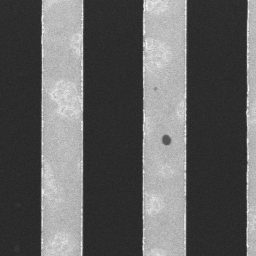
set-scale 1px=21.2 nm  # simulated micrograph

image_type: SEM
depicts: one or a few lines or trenches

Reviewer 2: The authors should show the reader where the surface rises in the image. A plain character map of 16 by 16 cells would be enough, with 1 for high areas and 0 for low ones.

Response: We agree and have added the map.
1110011110001111
1110011110001111
1110011110001110
1110011110001110
1110011110001110
1110011110001111
1110011110001110
1110011110001110
1110011110001110
1110011110001111
1110011110001111
1110011110001110
1110011110001110
1110011110001110
1110011110001110
1110011110001110